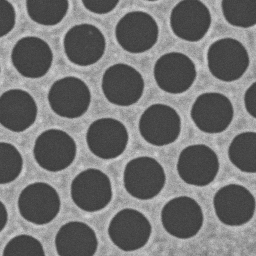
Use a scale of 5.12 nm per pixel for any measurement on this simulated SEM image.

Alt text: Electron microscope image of a regular array of holes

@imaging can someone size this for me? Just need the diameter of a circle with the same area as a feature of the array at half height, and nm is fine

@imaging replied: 218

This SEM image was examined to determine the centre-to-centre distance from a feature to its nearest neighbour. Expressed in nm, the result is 276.